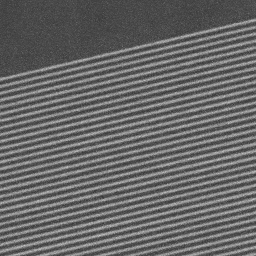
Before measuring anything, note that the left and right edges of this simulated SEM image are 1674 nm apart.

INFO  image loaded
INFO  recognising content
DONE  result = parallel lines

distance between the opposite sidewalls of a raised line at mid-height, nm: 11.9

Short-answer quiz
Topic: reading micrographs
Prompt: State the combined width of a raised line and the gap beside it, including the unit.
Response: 43.8 nanometers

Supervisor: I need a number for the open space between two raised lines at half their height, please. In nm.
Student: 29.4